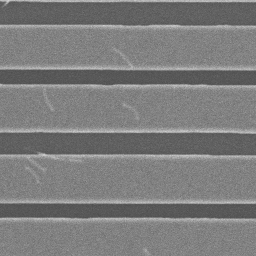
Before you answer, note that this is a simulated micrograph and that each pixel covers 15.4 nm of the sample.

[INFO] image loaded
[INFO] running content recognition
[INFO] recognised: lines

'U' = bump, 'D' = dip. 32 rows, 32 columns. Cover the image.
DDDDDDDDDDDDDDDDDDDDDDDDDDDDDDDD
DDDDDDDDDDDDDDDDDDDDDDDDDDDDDDDD
DDDDDDDDDDDDDDDDDDDDDDDDDDDDDDDD
UUUUUUUUUUUUUUUUUUUUUUUUUUUUUUUU
UUUUUUUUUUUUUUUUUUUUUUUUUUUUUUUU
UUUUUUUUUUUUUUUUUUUUUUUUUUUUUUUU
UUUUUUUUUUUUUUUUUUUUUUUUUUUUUUUU
UUUUUUUUUUUUUUUUUUUUUUUUUUUUUUUU
UUUUUUUUUUUUUUUUUUUUUUUUUUUUUUUU
DDDDDDDDDDDDDDDDDDDDDDDDDDDDDDDD
DDDDDDDDDDDDDDDDDDDDDDDDDDDDDDDD
UUUUUUUUUUUUUUUUUUUUUUUUUUUUUUUU
UUUUUUUUUUUUUUUUUUUUUUUUUUUUUUUU
UUUUUUUUUUUUUUUUUUUUUUUUUUUUUUUU
UUUUUUUUUUUUUUUUUUUUUUUUUUUUUUUU
UUUUUUUUUUUUUUUUUUUUUUUUUUUUUUUU
UUUUDUUUUUUUUUUUUUUUUUUUUUUUUUUU
DDDDDDDDDDDDDDDDDDDDDDDDDDDDDDDD
DDDDDDDDDDDDDDDDDDDDDDDDDDDDDDDD
UUUUUUUUUUUUUUUUUUUUUUUUUUUDDDDD
UUUUUUUUUUUUUUUUUUUUUUUUUUUUUUUU
UUUUUUUUUUUUUUUUUUUUUUUUUUUUUUUU
UUUUUUUUUUUUUUUUUUUUUUUUUUUUUUUU
UUUUUUUUUUUUUUUUUUUUUUUUUUUUUUUU
UUUUUUUUUUUUUUUUUUUUUUUUUUUUUUUU
DDDDDDDDDDDDDDDDDDDDDDDDDDDDDDDD
DDDDDDDDDDDDDDDDDDDDDDDDDDDDDDDD
UUUUUUUUUUUUUUUUUUUUUUUUUUUUUUUU
UUUUUUUUUUUUUUUUUUUUUUUUUUUUUUUU
UUUUUUUUUUUUUUUUUUUUUUUUUUUUUUUU
UUUUUUUUUUUUUUUUUUUUUUUUUUUUUUUU
UUUUUUUUUUUUUUUUUUUUUUUUUUUUUUUU